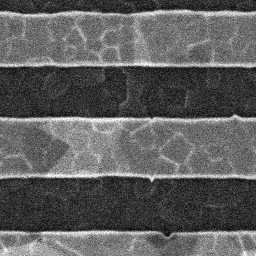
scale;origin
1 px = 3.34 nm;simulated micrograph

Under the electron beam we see one or a few lines or trenches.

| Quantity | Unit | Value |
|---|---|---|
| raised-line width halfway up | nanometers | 184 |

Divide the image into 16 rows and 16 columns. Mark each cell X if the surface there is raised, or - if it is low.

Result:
----------------
XXXXXXXXXXXXXXXX
XXXXXXXXXXXXXXXX
XXXXXXXXXXXXXXXX
----------------
----------------
----------------
XXXXXX-XXXX-XXXX
XXXXXXXXXXXXXXXX
XXXXXXXXXXXXXXXX
XXXXXXXXXXXXXXXX
----------------
----------------
----------------
----------------
XXXXXXXXXXXXXXXX